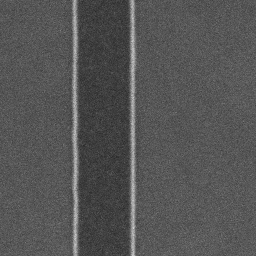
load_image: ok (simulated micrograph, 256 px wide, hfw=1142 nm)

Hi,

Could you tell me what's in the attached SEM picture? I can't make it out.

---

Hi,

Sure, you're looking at one or a few lines or trenches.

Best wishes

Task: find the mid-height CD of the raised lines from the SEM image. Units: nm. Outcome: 263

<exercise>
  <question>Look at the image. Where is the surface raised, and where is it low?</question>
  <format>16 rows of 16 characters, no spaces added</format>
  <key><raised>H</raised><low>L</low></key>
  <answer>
LLLLLHHHLLLLLLLL
LLLLLHHHLLLLLLLL
LLLLLHHHLLLLLLLL
LLLLLHHHLLLLLLLL
LLLLLHHHLLLLLLLL
LLLLLHHHLLLLLLLL
LLLLLHHHLLLLLLLL
LLLLLHHHLLLLLLLL
LLLLLHHHLLLLLLLL
LLLLLHHHLLLLLLLL
LLLLLHHHLLLLLLLL
LLLLLHHHLLLLLLLL
LLLLLHHHLLLLLLLL
LLLLLHHHLLLLLLLL
LLLLLHHHLLLLLLLL
LLLLLHHHLLLLLLLL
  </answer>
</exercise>